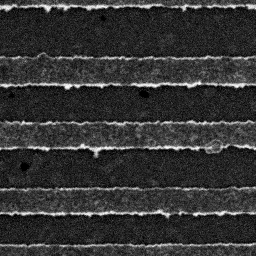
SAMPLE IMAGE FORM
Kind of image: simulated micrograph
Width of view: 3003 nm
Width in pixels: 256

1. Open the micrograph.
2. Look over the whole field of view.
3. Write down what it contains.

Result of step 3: one or a few lines or trenches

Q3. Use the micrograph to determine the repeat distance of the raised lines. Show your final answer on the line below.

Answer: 755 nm